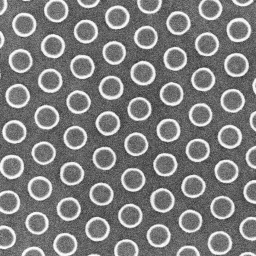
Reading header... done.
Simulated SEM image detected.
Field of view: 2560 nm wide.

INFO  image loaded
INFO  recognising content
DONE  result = a regular array of raised bodies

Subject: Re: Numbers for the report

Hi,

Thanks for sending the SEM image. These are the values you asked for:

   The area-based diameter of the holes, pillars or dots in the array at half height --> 219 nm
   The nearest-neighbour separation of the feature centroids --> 0.348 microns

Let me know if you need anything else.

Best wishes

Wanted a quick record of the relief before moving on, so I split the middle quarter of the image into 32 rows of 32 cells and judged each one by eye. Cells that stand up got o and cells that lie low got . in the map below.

..ooooo...........oooo....oooo..
..ooooo..........ooooo..........
..ooooo..........oooooo.........
...........oo....ooooo..........
..........oooo....ooo...........
.........ooooo...........oooo...
.........ooooo..........ooooo...
..ooo.....oooo..........ooooo...
.ooooo.....o.............oooo...
.ooooo...........oooo....oooo...
.ooooo..........ooooo...........
..oooo..........ooooo...........
..........oo....ooooo...........
.........oooo....ooo............
........oooooo...........ooo....
........oooooo..........oooo....
.oooo....oooo..........oooooo...
ooooo...................oooo....
ooooo...........oooo....oooo....
ooooo...........ooooo...........
.ooo...........oooooo..........o
........oooo....oooo...........o
........oooo.....oo............o
.......oooooo..........oooo.....
........oooo...........ooooo....
oooo....oooo...........ooooo....
oooo............oo.....ooooo....
ooooo..........ooooo....oo......
ooooo..........ooooo...........o
oooo...........ooooo..........oo
........ooo....oooo...........oo
.......ooooo.....o......oo....oo